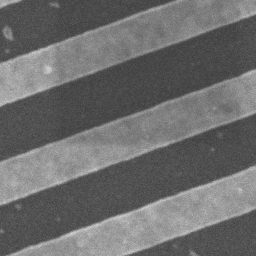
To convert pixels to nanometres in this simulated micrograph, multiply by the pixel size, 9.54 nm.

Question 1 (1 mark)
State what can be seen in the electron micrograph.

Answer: lines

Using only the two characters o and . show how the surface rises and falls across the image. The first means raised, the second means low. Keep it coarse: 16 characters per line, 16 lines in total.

..........oooooo
.......ooooooo..
....oooooooo....
.oooooooo.......
oooooo..........
ooo..........ooo
..........oooooo
.......oooooooo.
.....ooooooo....
..ooooooo.......
oooooo..........
oooo.........ooo
o.........oooooo
.......oooooooo.
.....ooooooo....
..ooooooo.......